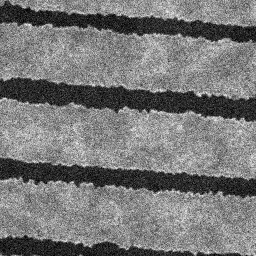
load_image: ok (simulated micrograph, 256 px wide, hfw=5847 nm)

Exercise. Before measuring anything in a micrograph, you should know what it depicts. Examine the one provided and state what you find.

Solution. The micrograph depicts one or a few lines or trenches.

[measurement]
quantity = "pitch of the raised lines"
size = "1790 nm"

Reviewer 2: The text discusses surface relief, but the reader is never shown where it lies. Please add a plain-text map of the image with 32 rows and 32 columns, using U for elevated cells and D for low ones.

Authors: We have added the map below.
DDUUUUUUUUUUUUUUUUUUUUUUUUUUUUUU
DDDDDDDDUUUUUUUUUUUUUUUUUUUUUUUU
DDDDDDDDDDDDDDDDDDDDDDDUDUUUUUUU
UUUUUUUDDUDDDDDDDDDDDDDDDDDDDDDD
UUUUUUUUUUUUUUUUUDUUUDDDDDDDDDDD
UUUUUUUUUUUUUUUUUUUUUUUUUUUUUUUU
UUUUUUUUUUUUUUUUUUUUUUUUUUUUUUUU
UUUUUUUUUUUUUUUUUUUUUUUUUUUUUUUU
UUUUUUUUUUUUUUUUUUUUUUUUUUUUUUUD
UUUUUUUUUUUUUUUUUUUUUUUUUUUUUUUD
DDDDDDDDDUUUUUUUUUUUUUUUUUUUUUUU
DDDDDDDDDDDDDDDDDDDDDDDDUUUUUUUU
UDDDDDDDDDDDDDDDDDDDDDDDDDDDDDDD
UUUUUUUUUUUDDDDDDDDDDDDDDDDDDDDD
UUUUUUUUUUUUUUUUUUUUUUUUUDDDDDDD
UUUUUUUUUUUUUUUUUUUUUUUUUUUUUUUU
UDUUUUUUUUUUUUUUUUUUUUUUUUUUUUUU
UUUUUUUUUUUUUUUUUUUUUUUUUUUUUUUU
UUUUUUUUUUUUUUUUUUUUUUUUUUUUUUUU
UUUUUUUUUDUUUUUUUUUUUUUUUUUUUUUU
DDDDDDDDUUUUUUUUUUUUUUUUUUUUUUUU
DDDDDDDDDDDDDDDDDDDDDUUUUUUUUUUU
DUDDDDDDDDDDDDDDDDDDDDDDDDDDDDDD
UUUUUUUUUUUUDUUDDDDDDDDDDDDDDDDD
UUUUUUUUUUUUUUUUUUUUUUUUUUUUDDDD
UUUUUUUUUUUUUUUUUUUUUUUUUUUUUUUU
UUUUUUUUUUUUUUUUUUUUUUUUUUUUUUUU
UUUUUUUUUUUUUUUUUUUUUUUUUUUUUUUU
UUUUUDUUUUUUUUUUUUUUUUUUUUUUUUUU
UDDDUUUUUUUUUUUUUUUUUUUUUUUUUUUU
DDDDDDDDDDUUDDDUUUUUUUUUUUUUUUUU
DDDDDDDDDDDDDDDDDDDDDDDDUUUUUUUU